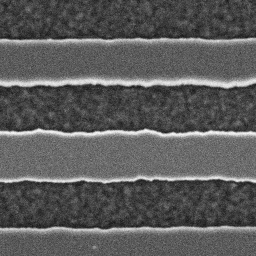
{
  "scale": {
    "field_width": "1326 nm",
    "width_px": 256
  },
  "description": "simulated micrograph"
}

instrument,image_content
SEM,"lines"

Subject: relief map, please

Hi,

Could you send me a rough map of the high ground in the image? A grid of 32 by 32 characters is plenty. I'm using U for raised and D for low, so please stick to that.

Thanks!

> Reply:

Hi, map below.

DDDDDDDDDDDDDDDDDDDDDDDDDDDDDDDD
DDDDDDDDDDDDDDDDDDDDDDDDDDDDDDDD
DDDDDDDDDDDDDDDDDDDDDDDDDDDDDDDD
DDDDDDDDDDDDDDDDDDDDDDDDDDDDDDDD
DDDDDDDDDDDDDDDDDDDDDDDDDDDDDDDD
UUUUUUUUUUUUUUUUUUUUUUUUUUUUUUUU
UUUUUUUUUUUUUUUUUUUUUUUUUUUUUUUU
UUUUUUUUUUUUUUUUUUUUUUUUUUUUUUUU
UUUUUUUUUUUUUUUUUUUUUUUUUUUUUUUU
UUUUUUUUUUUUUUUUUUUUUUUUUUUUUUUU
UUUUUUUUDDDDDDDUUUUDUUDDDDUUUUUD
DDDDDDDDDDDDDDDDDDDDDDDDDDDDDDDD
DDDDDDDDDDDDDDDDDDDDDDDDDDDDDDDD
DDDDDDDDDDDDDDDDDDDDDDDDDDDDDDDD
DDDDDDDDDDDDDDDDDDDDDDDDDDDDDDDD
DDDDDDDDDDDDDDDDDDDDDDDDDDDDDDDD
UUUUUUUUDDDDUUUUUUUUDDDDUDUUDDDU
UUUUUUUUUUUUUUUUUUUUUUUUUUUUUUUU
UUUUUUUUUUUUUUUUUUUUUUUUUUUUUUUU
UUUUUUUUUUUUUUUUUUUUUUUUUUUUUUUU
UUUUUUUUUUUUUUUUUUUUUUUUUUUUUUUU
UUUUUUUUUUUUUUUUUUUUUUUUUUUUUUUU
UUUUUUUUUUUUUUUUUDUDDUDDDDDDUUUU
DDDDDDDDDDDDDDDDDDDDDDDDDDDDDDDD
DDDDDDDDDDDDDDDDDDDDDDDDDDDDDDDD
DDDDDDDDDDDDDDDDDDDDDDDDDDDDDDDD
DDDDDDDDDDDDDDDDDDDDDDDDDDDDDDDD
DDDDDDDDDDDDDDDDDDDDDDDDDDDDDDDD
DDDDDDUUDDDDDDDDDUUDDUUUUDUUUUUU
UUUUUUUUUUUUUUUUUUUUUUUUUUUUUUUU
UUUUUUUUUUUUUUUUUUUUUUUUUUUUUUUU
UUUUUUUUUUUUUUUUUUUUUUUUUUUUUUUU